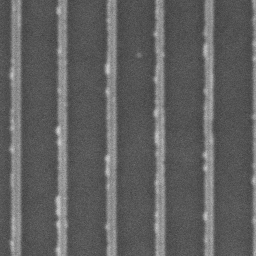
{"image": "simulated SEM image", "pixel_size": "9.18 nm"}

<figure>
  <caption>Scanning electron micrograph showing lines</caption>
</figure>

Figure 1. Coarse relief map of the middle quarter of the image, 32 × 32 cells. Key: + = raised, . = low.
...........++..........++.......
...........++..........++.......
...........++..........++.......
...........++..........++.......
...........++..........++.......
...........++..........++.......
...........++..........++.......
...........++..........++.......
...........++..........++.......
+..........++..........++.......
+..........++..........++.......
...........++..........++.......
...........++..........++.......
...........++..........++.......
...........++..........++.......
...........++..........++.......
...........++..........++.......
...........++..........++.......
...........++..........++.......
...........++..........++.......
...........++..........++.......
...........++..........++.......
...........++..........++.......
...........++..........++.......
...........++..........++.......
...........++..........++.......
...........++..........++.......
...........++..........++.......
...........++..........++.......
...........++..........++.......
...........++..........++.......
...........++..........++.......